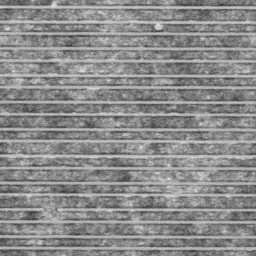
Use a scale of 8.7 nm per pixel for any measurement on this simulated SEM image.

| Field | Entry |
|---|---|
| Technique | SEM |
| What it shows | parallel lines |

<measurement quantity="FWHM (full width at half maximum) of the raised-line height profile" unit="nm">22.8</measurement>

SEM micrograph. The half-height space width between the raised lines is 84.3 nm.